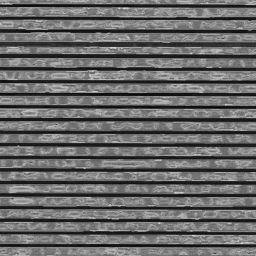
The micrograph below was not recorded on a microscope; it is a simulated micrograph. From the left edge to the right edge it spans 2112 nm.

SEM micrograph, parallel lines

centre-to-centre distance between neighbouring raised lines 12.6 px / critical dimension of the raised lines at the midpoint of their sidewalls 74.2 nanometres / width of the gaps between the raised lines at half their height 29.9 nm